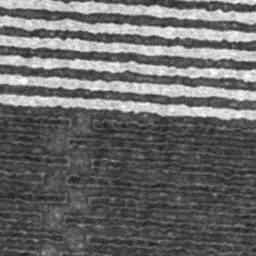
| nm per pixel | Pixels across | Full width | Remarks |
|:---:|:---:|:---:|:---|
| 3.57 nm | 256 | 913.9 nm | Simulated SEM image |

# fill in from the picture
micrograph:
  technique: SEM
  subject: parallel lines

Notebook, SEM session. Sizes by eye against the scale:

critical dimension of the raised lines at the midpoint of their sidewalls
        0.0294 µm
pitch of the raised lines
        19.2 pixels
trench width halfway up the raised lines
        39.2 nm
